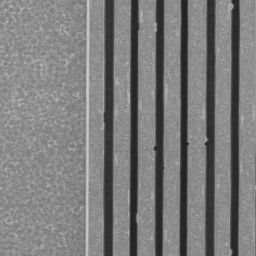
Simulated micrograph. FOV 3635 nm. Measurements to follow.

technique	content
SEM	parallel lines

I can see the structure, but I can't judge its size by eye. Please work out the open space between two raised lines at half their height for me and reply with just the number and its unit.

105 nm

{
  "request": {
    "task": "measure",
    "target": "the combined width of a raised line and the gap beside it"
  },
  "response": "25.4 px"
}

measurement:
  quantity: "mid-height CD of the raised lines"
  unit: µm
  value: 0.248